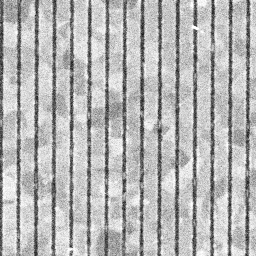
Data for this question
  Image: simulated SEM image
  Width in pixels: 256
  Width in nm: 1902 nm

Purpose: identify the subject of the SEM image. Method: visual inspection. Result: parallel lines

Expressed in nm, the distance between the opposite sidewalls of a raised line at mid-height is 95.7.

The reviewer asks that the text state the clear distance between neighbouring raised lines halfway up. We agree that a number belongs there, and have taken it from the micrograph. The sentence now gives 35.3 nanometres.